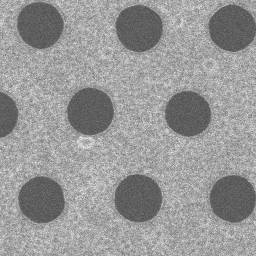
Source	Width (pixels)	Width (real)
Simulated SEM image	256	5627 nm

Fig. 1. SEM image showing holes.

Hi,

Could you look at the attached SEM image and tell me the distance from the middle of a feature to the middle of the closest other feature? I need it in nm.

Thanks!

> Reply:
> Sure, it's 2130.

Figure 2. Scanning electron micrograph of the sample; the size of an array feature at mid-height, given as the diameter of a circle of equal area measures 1.04 µm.